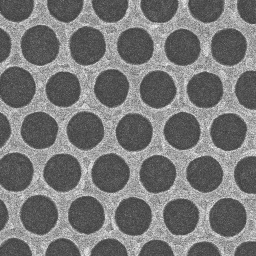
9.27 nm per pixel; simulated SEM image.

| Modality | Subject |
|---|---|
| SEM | a regular array of holes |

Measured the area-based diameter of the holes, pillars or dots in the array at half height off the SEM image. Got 348 nm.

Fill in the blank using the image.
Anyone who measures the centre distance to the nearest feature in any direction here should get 0.436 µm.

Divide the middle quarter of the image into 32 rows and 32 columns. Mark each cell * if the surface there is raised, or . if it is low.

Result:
********************************
***********..*******************
..*******......******.....******
...*****........****.......*****
....****........***.........***.
....****........***.........***.
....***.........***.........***.
....****........***.........***.
....****........***.........***.
...******......*****.......*****
.**********...*******.....******
********************************
***.....********...*********....
**.......******......*****......
*.........****.......*****......
*.........***.........***.......
*.........***.........***.......
*.........***.........***.......
*.........***.........***.......
**.......****.........****......
***.....******.......******.....
****..*********....**********.**
***********..*******************
...*****......*******.....******
....****.......*****.......*****
....***.........***.........***.
....***..........**.........***.
....***..........**.........**..
....***.........***.........***.
....***.........***.........***.
...*****.......*****.......*****
..*******.....*******.....******